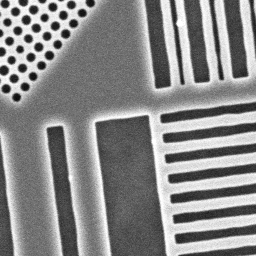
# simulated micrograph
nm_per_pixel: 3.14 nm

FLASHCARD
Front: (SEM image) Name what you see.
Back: groups of lines, slits or small figures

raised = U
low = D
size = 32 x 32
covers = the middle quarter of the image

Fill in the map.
UUUUUUUUUUUUUUUUUUUUUUDDDDUUDDUU
UUUUUUUUUUUUUUUUUUUUUUDDDDDUUDUU
UUUUUUUUUUUUUUUUUUUUUUDDDDDUUDUU
UUUUUUUUUUUUUUUUUUUUUUUDDDDUUDUU
UUUUUUUUUUUUUUUUUUUUUUUDDDDUUDUU
UUUUUUUUUUUUUUUUUUUUUUUDDDDUUUUU
UUUUUUUUUUUUUUUUUUUUUUUUUUUUUUUU
UUUUUUUUUUUUUUUUUUUUUUUUUUUUUUUU
UUUUUUUUUUUUUUUUUUUUUUUUUUUUUUUU
UUUUUUUUUUUUUUUUUUUUUUUUUUUUUUUU
UUUUUUUUUUUUUUUUUUUUUUUUUUUUUUUU
UUUUUUUUUUUUUUUUUUUUUUUUUUUUUUDD
UUUUUUUUUUUUUUUUUUUUUUUUUDDDDDDD
UUUUUUUUUUUUUUUDDDDDDUUUDDDDDDDD
UUUUUUUUDDDDDDDDDDDDDDUUDDDDDUUU
UUUUUUUUDDDDDDDDDDDDDDUUUUUUUUUU
UUUUUUUUDDDDDDDDDDDDDDUUUUUUUUUD
UUUUUUUUDDDDDDDDDDDDDDUUUDDDDDDD
UUUUUUUUDDDDDDDDDDDDDDUUUDDDDDDD
UUUUUUUUDDDDDDDDDDDDDDUUUDDDDDUU
DUUUUUUUDDDDDDDDDDDDDDUUUUUUUUUU
DUUUUUUUDDDDDDDDDDDDDDDUUUUUUUUU
DUUUUUUUDDDDDDDDDDDDDDDUUDDDDDDD
DUUUUUUUUDDDDDDDDDDDDDDUUDDDDDDD
DUUUUUUUUDDDDDDDDDDDDDDUUDDDDDUU
DUUUUUUUUDDDDDDDDDDDDDDUUUUUUUUU
DUUUUUUUUDDDDDDDDDDDDDDUUUUUUUUU
DUUUUUUUUDDDDDDDDDDDDDDUUUDDDDDD
DUUUUUUUUDDDDDDDDDDDDDDUUUDDDDDD
DDUUUUUUUDDDDDDDDDDDDDDUUUDDDDDU
DDUUUUUUUUDDDDDDDDDDDDDDUUUUUUUU
DDUUUUUUUUDDDDDDDDDDDDDDUUUUUUUU